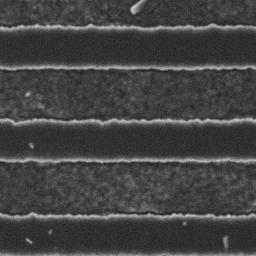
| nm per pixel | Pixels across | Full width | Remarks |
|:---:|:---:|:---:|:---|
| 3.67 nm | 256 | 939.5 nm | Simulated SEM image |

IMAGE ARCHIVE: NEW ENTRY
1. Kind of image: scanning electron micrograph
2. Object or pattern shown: lines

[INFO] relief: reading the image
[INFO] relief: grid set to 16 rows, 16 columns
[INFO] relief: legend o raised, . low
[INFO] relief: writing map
................
................
oooooooooooooooo
oooooooooooooooo
................
................
................
o.o............o
oooooooooooooooo
oooooooooooooooo
................
................
................
oooooooooooooooo
oooooooooooooooo
oooooooooooooooo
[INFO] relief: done